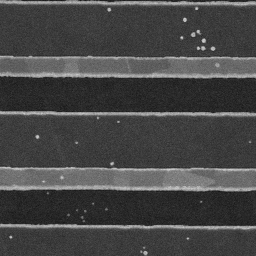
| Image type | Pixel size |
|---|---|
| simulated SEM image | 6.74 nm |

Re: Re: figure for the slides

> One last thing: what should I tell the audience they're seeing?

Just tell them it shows lines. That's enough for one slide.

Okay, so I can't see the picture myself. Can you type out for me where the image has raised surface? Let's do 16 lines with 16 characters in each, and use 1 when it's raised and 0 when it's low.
1111111111111111
1111111111111111
1111111111111111
1111111111111111
1111111111111111
0000000000000000
0000000000000000
1111111111111111
1111111111111111
1111111111111111
1111111111111111
1111111111111111
0000000000000000
0000000000000000
1111111111111111
1111111111111111